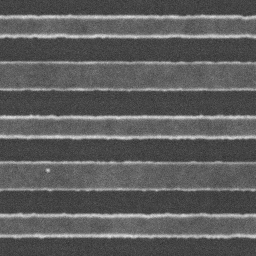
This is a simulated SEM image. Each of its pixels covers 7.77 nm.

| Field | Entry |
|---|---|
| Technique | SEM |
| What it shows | lines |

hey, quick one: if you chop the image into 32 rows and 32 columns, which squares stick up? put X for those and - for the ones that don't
--------------------------------
--------------------------------
XXXXXXXXXXXXXXXXXXXXXXXXXXXXXXXX
XXXXXXXXXXXXXXXXXXXXXXXXXXXXXXXX
XXXXXXXXXXXXXXXXXXXXXXXXXXXXXXXX
--------------------------------
--------------------------------
--------------------------------
XXXXXXXXXXXXXXXXXXXXXXXXXXXXXXXX
XXXXXXXXXXXXXXXXXXXXXXXXXXXXXXXX
XXXXXXXXXXXXXXXXXXXXXXXXXXXXXXXX
--------------------------------
--------------------------------
--------------------------------
--------------------------------
XXXXXXXXXXXXXXXXXXXXXXXXXXXXXXXX
XXXXXXXXXXXXXXXXXXXXXXXXXXXXXXXX
--------------------------------
--------------------------------
--------------------------------
XXXXXXXXXXXXXXXXXXXXXXXXXXXXXXXX
XXXXXXXXXXXXXXXXXXXXXXXXXXXXXXXX
XXXXXXXXXXXXXXXXXXXXXXXXXXXXXXXX
XXXXXXXXXXXXXXXXXXXXXXXXXXXXXXXX
--------------------------------
--------------------------------
--------------------------------
XXXXXXXXXXXXXXXXXXXXXXXXXXXXXXXX
XXXXXXXXXXXXXXXXXXXXXXXXXXXXXXXX
XXXXXXXXXXXXXXXXXXXXXXXXXXXXXXXX
--------------------------------
--------------------------------